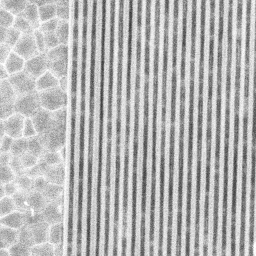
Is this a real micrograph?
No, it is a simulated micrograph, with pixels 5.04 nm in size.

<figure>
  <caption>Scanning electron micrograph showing parallel lines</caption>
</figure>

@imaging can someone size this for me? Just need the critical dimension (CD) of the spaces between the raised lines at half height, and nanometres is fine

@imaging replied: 22.7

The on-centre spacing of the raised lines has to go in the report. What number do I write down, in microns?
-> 0.0457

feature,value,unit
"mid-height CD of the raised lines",22.1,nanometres